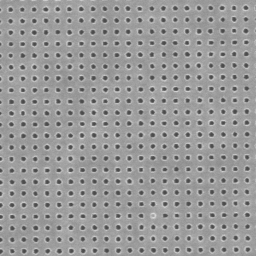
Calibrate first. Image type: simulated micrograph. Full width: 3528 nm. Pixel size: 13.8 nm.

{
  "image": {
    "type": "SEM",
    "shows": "a regular array of holes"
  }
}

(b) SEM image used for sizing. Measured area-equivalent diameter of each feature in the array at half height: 66 nm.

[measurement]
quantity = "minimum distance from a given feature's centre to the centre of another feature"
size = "154 nanometers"